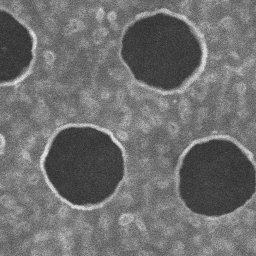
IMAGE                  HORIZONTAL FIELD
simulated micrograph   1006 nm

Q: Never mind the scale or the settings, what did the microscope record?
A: holes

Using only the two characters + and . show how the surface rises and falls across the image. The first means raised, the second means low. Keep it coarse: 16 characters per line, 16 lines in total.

++++++++++++++++
.+++++++....++++
..++++++....++++
..++++++.....+++
.+++++++....++++
++++++++++.+++++
++++++++++++++++
++++++++++++++++
++++...+++++++++
+++.....++++...+
+++.....+++.....
+++....++++.....
++++...++++.....
++++++++++++++++
++++++++++++++++
++++++++++++++++